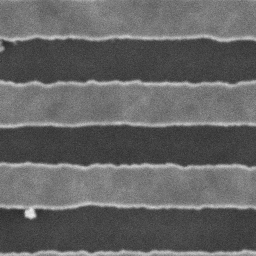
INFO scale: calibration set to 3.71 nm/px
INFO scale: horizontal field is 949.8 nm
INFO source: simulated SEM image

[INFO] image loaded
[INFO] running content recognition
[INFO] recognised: lines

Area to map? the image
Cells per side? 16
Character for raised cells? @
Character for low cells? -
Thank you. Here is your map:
@@@@@@@@@@@@@@@@
@@@@@@@@@@@@@@@@
@@-----------@@-
----------------
----------------
@@@@@@@@@@@@@@@@
@@@@@@@@@@@@@@@@
@@@@@@@@@@@@@@@@
----------------
----------------
@@@@@@@@@@@@@@@@
@@@@@@@@@@@@@@@@
@@@@@@@@@@@@@@@@
----------------
----------------
----------------